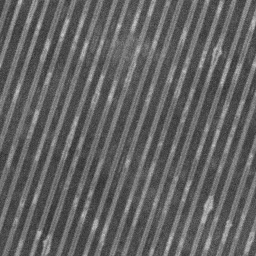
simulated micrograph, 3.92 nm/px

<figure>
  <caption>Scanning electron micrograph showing parallel lines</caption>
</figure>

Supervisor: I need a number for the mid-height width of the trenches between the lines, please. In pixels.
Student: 8.78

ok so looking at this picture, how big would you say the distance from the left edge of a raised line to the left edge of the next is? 49.7 nm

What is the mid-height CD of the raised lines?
0.0117 microns